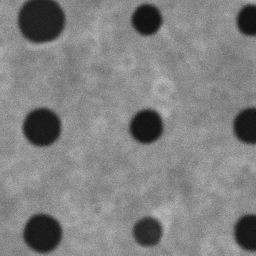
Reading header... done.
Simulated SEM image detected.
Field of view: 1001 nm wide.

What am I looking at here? holes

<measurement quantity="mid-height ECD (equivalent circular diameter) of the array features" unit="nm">131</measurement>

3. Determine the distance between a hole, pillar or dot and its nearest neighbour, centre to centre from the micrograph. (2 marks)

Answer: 0.411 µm